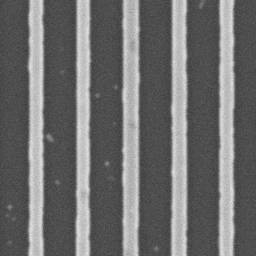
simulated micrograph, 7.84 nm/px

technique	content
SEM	lines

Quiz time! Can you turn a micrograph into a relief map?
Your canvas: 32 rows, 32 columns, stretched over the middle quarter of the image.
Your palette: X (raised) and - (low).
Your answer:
---XXX---------XXX---------XXX--
---XXX---------XXX---------XXX--
---XXX---------XXXX--------XXX--
---XXX---------XXXX--------XXX--
---XXX---------XXXX--------XXX--
---XXX---------XXX---------XXX--
---XXX---------XXX---------XXX--
---XXX---------XXX---------XXX--
---XXX---------XXX---------XXX--
---XXX---------XXX---------XXX--
---XXX---------XXX---------XXX--
---XXX---------XXX---------XXX--
---XXX---------XXX---------XXX--
---XXX---------XXX---------XXX--
---XXX---------XXX---------XXX--
---XXX---------XXX---------XXX--
---XXX---------XXX---------XXX--
---XXX---------XXX---------XXX--
---XXX---------XXX---------XXX--
---XXX---------XXX---------XXX--
---XXX---------XXX---------XXX--
---XXX---------XXX---------XXX--
---XXX---------XXX---------XXX--
---XXX---------XXX---------XXX--
---XXX---------XXX---------XXX--
---XXX---------XXX---------XXX--
---XXX---------XXX---------XXX--
---XXX---------XXX---------XXX--
---XXX---------XXX---------XXX--
---XXX---------XXX---------XXX--
---XXX---------XXX---------XXX--
---XXX---------XXX---------XXX--